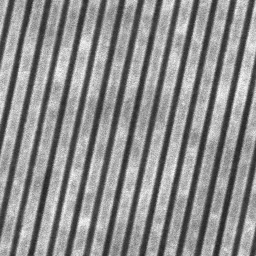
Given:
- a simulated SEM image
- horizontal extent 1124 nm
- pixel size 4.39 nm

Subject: parallel lines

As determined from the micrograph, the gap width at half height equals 30.1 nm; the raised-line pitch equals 79.4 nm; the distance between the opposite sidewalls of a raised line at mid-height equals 51.6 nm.